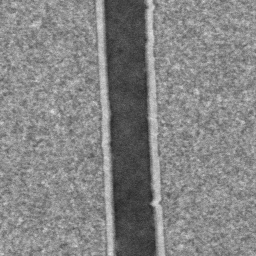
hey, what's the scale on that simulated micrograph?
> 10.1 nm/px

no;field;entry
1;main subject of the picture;one or a few lines or trenches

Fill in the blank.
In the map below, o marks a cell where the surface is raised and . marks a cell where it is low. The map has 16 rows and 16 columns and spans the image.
oooooo...ooooooo
oooooo...ooooooo
oooooo...ooooooo
oooooo...ooooooo
oooooo...ooooooo
oooooo....oooooo
ooooooo...oooooo
ooooooo...oooooo
ooooooo...oooooo
ooooooo...oooooo
ooooooo...oooooo
ooooooo...oooooo
ooooooo...oooooo
ooooooo...oooooo
ooooooo...oooooo
ooooooo...oooooo